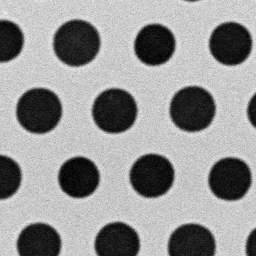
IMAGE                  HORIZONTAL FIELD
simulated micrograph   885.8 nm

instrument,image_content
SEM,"a regular array of holes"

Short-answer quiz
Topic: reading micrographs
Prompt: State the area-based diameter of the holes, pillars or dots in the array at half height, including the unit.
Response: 153 nanometers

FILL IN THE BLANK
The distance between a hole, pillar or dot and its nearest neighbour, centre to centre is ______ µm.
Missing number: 0.259